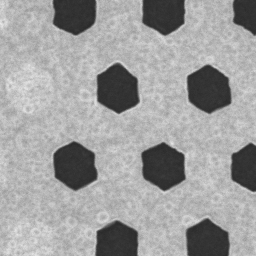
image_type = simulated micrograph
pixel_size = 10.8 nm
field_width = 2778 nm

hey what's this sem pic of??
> holes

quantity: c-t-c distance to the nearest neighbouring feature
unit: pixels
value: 88.2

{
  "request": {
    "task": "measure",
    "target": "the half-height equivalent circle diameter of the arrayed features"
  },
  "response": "490 nm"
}